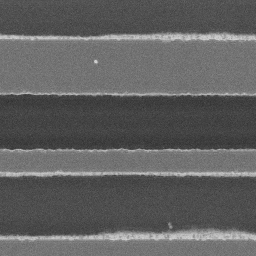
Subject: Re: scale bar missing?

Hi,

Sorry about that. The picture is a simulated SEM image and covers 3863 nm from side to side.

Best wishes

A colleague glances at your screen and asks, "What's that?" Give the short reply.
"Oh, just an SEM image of lines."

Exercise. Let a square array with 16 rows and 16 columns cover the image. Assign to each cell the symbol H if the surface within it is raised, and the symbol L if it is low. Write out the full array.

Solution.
LLLLLLLLLLLLLLLL
LLLLLLLLLLLLLLLL
HHHHHHHHHHHHHHHH
HHHHHHHHHHHHHHHH
HHHHHHHHHHHHHHHH
HHHHHHHHHHHHHHHH
LLLLLLLLLLLLLLLL
LLLLLLLLLLLLLLLL
LLLLLLLLLLLLLLLL
HHHHHHHHHHHHHHHH
HHHHHHHHHHHHHHHH
LLLLLLLLLLLLLLLL
LLLLLLLLLLLLLLLL
LLLLLLLLLLLLLLLL
LLLLLLLLLLLLLLLL
HHHHHHHHHHHHHHHH